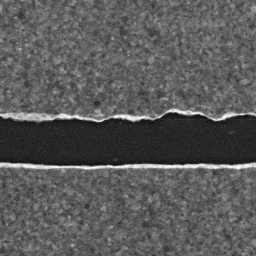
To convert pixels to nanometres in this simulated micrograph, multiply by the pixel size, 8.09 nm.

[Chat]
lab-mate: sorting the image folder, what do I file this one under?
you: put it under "one or a few lines or trenches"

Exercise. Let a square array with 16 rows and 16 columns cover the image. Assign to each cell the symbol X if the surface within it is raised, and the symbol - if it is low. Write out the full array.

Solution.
XXXXXXXXXXXXXXXX
XXXXXXXXXXXXXXXX
XXXXXXXXXXXXXXXX
XXXXXXXXXXXXXXXX
XXXXXXXXXXXXXXXX
XXXXXXXXXXXXXXXX
XXXXXXXXXXXXXXXX
------X---------
----------------
----------------
XXXXXXXXXXXXXXXX
XXXXXXXXXXXXXXXX
XXXXXXXXXXXXXXXX
XXXXXXXXXXXXXXXX
XXXXXXXXXXXXXXXX
XXXXXXXXXXXXXXXX